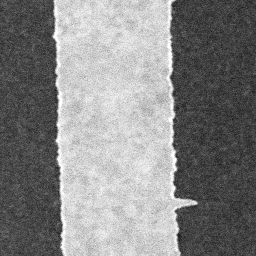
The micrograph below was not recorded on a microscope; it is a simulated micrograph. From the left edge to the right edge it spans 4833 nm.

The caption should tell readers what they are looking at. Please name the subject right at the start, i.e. one or a few lines or trenches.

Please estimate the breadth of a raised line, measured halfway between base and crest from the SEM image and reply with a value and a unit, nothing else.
2.15 µm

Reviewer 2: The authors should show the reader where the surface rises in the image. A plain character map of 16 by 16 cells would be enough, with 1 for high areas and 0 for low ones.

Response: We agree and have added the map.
0001111111100000
0001111111100000
0000111111100000
0000111111100000
0000111111100000
0000111111100000
0000111111100000
0000111111100000
0000111111100000
0000111111100000
0000111111100000
0000111111100000
0000111111100000
0000111111100000
0000111111100000
0000111111100000